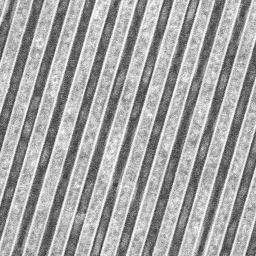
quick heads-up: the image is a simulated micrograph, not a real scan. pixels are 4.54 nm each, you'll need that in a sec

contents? parallel lines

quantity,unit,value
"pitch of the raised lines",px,24.9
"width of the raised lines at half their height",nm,61.6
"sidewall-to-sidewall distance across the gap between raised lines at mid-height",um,0.0529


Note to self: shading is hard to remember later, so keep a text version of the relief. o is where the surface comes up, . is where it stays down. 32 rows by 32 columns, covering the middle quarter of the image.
....ooo...ooo...oooo...ooo...ooo
...oooo...ooo...oooo..oooo...ooo
...ooo...oooo...ooo...oooo...ooo
...ooo...oooo...ooo...ooo....ooo
..oooo...ooo...oooo...ooo...oooo
..ooo...oooo...oooo..oooo...ooo.
..ooo...oooo...ooo...oooo...ooo.
..ooo...ooo...oooo...ooo...oooo.
.ooo....ooo...oooo..oooo...oooo.
.ooo...oooo...ooo...oooo...ooo..
.ooo...ooo....ooo...ooo...oooo..
oooo...ooo...oooo...ooo...oooo..
ooo...oooo...ooo...oooo...ooo...
ooo...oooo...ooo...oooo...ooo...
ooo...ooo...oooo...ooo...oooo...
oo....ooo...oooo..oooo...oooo...
oo...oooo...ooo...oooo...ooo...o
oo...ooo....ooo...ooo...oooo...o
oo...ooo...oooo...ooo...oooo...o
o...oooo...ooo...oooo...ooo...oo
o...oooo...ooo...oooo...ooo...oo
o...ooo...oooo...ooo...oooo...oo
...oooo...oooo..oooo...oooo...oo
...oooo...ooo...oooo...ooo...ooo
...ooo....ooo...ooo...oooo...ooo
...ooo...oooo...ooo...oooo...ooo
..oooo...ooo...oooo...ooo...oooo
..oooo...ooo...ooo....ooo...oooo
..ooo...oooo...ooo...oooo...ooo.
.oooo...oooo..oooo...ooo....ooo.
.oooo...ooo...oooo...ooo...oooo.
.ooo...oooo...ooo...oooo...ooo..